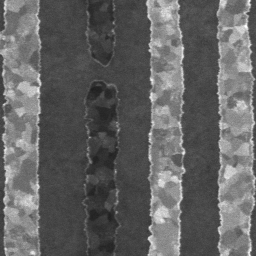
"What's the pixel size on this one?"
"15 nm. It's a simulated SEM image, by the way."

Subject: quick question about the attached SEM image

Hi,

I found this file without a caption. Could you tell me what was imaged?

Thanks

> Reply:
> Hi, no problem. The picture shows one or a few lines or trenches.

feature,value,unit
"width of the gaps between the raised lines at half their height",581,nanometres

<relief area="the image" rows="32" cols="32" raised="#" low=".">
.####......###....####......###.
.####......###....####.....####.
.####......###.....###.....####.
.####......###.....###.....####.
#####......###.....####....####.
#####......###.....####....####.
#####......###.....####....####.
.####.......##.....####....####.
#####..............####....####.
#####..............####....#####
.####......##......####....#####
.####......####....####....####.
.####......####....####....####.
#####......####....####.....####
.####......####....####.....####
.####......####....####....#####
.####......####....#.##.....####
#####......#.##....#.##.....####
.#.##......####....####.....####
.####......####....#.##.....####
.####......###.....####.....####
.####......###.....####....#####
.####......###.....####....#####
.####......####....####....#####
.####......####....####....#####
.####......###.....###.....#####
.####......###.....###.....####.
.####......####....###......###.
.####......####....###.....####.
.####......####....###.....####.
.####......###.....###.....####.
.####......###.....###......###.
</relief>